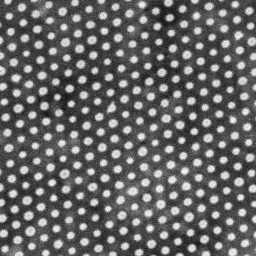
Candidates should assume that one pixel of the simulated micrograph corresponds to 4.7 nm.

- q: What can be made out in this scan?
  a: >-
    a regular array of raised bodies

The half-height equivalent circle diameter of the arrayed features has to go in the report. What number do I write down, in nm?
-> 31.8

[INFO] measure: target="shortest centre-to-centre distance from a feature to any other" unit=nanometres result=70.2